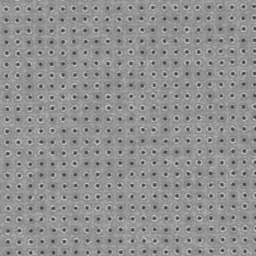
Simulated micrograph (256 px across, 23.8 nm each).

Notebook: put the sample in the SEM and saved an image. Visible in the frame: a regular array of holes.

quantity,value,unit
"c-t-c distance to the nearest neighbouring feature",256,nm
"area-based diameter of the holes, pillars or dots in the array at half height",0.0966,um